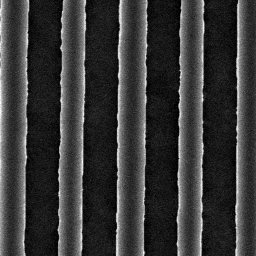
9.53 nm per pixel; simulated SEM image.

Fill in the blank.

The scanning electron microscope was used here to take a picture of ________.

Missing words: lines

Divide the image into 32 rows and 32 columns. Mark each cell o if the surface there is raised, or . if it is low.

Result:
oooo....ooo....ooo.....oo.....oo
oooo....ooo....ooo.....oo.....oo
ooo.....ooo....ooo.....oo.....oo
ooo.....ooo....ooo....ooo.....oo
ooo.....ooo....ooo....ooo.....oo
ooo.....ooo....ooo.....oo.....oo
ooo.....ooo....ooo.....oo.....oo
ooo.....ooo....ooo....ooo.....oo
ooo.....ooo....ooo....ooo.....oo
ooo.....ooo....ooo.....oo.....oo
ooo.....ooo....ooo....ooo.....oo
ooo.....ooo....ooo....ooo.....oo
ooo.....ooo....ooo....ooo.....oo
ooo.....oo.....ooo....ooo.....oo
ooo.....oo.....ooo....ooo.....oo
ooo.....oo.....ooo....ooo.....oo
ooo.....oo.....ooo....ooo.....oo
ooo.....oo.....ooo....ooo.....oo
ooo....ooo.....ooo....ooo.....oo
ooo....ooo.....ooo....ooo.....oo
ooo....ooo.....ooo....ooo.....oo
ooo....ooo.....ooo....ooo.....oo
ooo....ooo.....ooo....ooo.....oo
ooo....ooo.....ooo....ooo.....oo
ooo....ooo.....ooo....ooo.....oo
ooo....ooo.....ooo....ooo....ooo
ooo....ooo.....ooo....ooo....ooo
ooo....ooo.....ooo....ooo....ooo
ooo....ooo.....ooo....ooo.....oo
ooo....ooo.....ooo....ooo.....oo
ooo....ooo.....ooo....ooo.....oo
ooo....ooo.....ooo....ooo....ooo